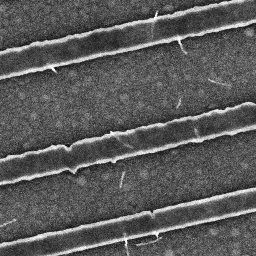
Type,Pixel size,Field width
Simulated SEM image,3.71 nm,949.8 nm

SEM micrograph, one or a few lines or trenches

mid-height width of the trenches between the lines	252	nm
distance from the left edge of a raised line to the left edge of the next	350	nanometers